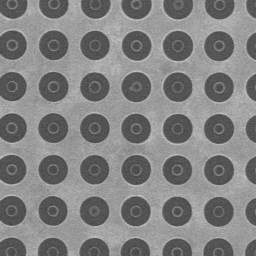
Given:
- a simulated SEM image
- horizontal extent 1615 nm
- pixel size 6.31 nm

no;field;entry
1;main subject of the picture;an array of small figures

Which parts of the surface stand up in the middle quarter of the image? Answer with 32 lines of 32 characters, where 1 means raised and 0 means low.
11111111111111111111111111111111
11111111111111111111111111111111
11111100001111110000111111000011
11111000000111100000011110000001
01110000000111000000001110001000
01110011100011000110001110011100
01110001100111000010001110011100
01110000000111100000001110000000
11111000001111100000011111000001
11111110111111111001111111110111
11111111111111111111111111111111
11111111111111111111111111111111
11111100011111111001111111100111
11111000001111100000011111000001
01110000000111100000001110000000
01110011100111000110001100011000
01110011100111000110001100011100
01110000000111100000001110000000
11111000000111100000011110000001
11111100011111110000101111000011
11111111111111111111111111111111
11111111111111111111111111111111
11111111111111111101111111111111
11111000001111110000011111000001
01110000000111100000011110000000
01110001000111000110001110001000
01110011100111000110001100011000
01110001000111000110001110001000
11110000000111100000011110000000
11111100001111110000111111000001
11111111111111111111111111111111
11111111111111111111111111111111